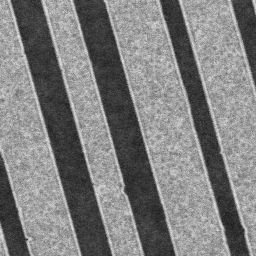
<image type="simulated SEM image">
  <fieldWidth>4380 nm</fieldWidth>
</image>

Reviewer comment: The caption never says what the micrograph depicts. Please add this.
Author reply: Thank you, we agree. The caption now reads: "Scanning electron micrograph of one or a few lines or trenches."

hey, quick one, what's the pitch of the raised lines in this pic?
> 1.22 micrometres